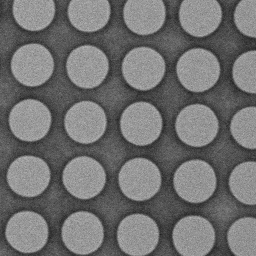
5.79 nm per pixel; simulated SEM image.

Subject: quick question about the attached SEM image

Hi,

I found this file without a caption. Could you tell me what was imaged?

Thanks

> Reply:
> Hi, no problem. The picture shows an array of small figures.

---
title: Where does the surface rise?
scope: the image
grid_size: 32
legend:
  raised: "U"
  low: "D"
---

DDUUUUUDDUUUUUDDUUUUDDDUUUUDDDUU
DDUUUUUDDUUUUUDDUUUUUDUUUUUUDUUU
DDUUUUDDDUUUUDDDUUUUUDUUUUUUDUUU
DDDUUDDDDDUUUDDDUUUUDDDUUUUDDDUU
DDDDDDDDDDDDDDDDDDDDDDDDDUDDDDDU
DDDDDDDDDDDDDDDDDDDDDDDDDDDDDDDD
DDUUUUDDDUUUUDDDUUUUDDDUUUDDDDDU
DDUUUUUDUUUUUDDDUUUUDDUUUUUDDDUU
DUUUUUUDUUUUUDDUUUUUUDUUUUUDDUUU
DDUUUUDDDUUUUDDDUUUUDDUUUUUDDUUU
DDDUUDDDDUUUDDDDUUUUDDDUUUUDDDUU
DDDDDDDDDDDDDDDDDDDDDDDDDDDDDDDU
DDDDDDDDDDDDDDDDDDDDDDDDDDDDDDDD
DDUUUUDDDUUUUDDDUUUDDDDUUUDDDDDU
DUUUUUDDUUUUUDDUUUUUDDUUUUUDDUUU
DUUUUUDDUUUUUDDUUUUUDDUUUUUDDUUU
DDUUUUDDUUUUUDDUUUUUDDUUUUUDDUUU
DDDUUDDDDUUUDDDDUUUDDDDUUUDDDDUU
DDDDDDDDDDDDDDDDDDDDDDDDDDDDDDDU
DDDDDDDDDDDDDDDDDDDDDDDDDDDDDDDD
DUUUUUDDDUUUDDDDUUUDDDDUUUDDDDUU
DUUUUUDDUUUUUDDUUUUUDDUUUUUDDUUU
DUUUUUDDUUUUUDDUUUUUDDUUUUUDDUUU
DUUUUUDDUUUUUDDUUUUUDDUUUUUDDUUU
DDDUDDDDDUUUDDDDUUUDDDDUUUDDDUUU
DDDDDDDDDDDDDDDDDDDDDDDDDDDDDDDD
DDDUDDDDDDDDDDDDDDDDDDDDDDDDDDDD
DUUUUUDDUUUUDDDUUUUDDDDUUUDDDDUU
DUUUUUDDUUUUUDDUUUUUDDUUUUUDDUUU
DUUUUUDDUUUUUDDUUUUUDDUUUUUDDUUU
DUUUUUDDUUUUUDDUUUUUDDUUUUUDDUUU
DDDUDDDDDUUDDDDDUUUDDDUUUUDDDUUU